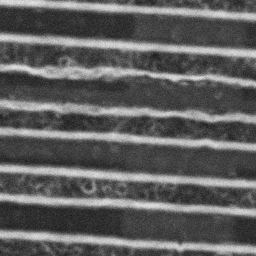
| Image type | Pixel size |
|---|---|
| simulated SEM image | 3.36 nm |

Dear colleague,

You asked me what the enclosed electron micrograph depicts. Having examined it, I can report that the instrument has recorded one or a few lines or trenches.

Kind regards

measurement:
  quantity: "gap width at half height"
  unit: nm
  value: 119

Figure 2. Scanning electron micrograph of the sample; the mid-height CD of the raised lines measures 98.5 nm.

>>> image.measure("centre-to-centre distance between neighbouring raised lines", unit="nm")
219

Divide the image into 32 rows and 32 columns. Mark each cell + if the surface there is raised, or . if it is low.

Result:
.....+++++++++++++++++++++++++++
.......................+++++++++
................................
................................
................................
+++++++++++++...................
+++++++++++++++++++++++++++++...
++++++++++++++++++++++++++++++++
+.++++++++++++++++++++++++++++++
....................++++++++++++
................................
................................
................................
++++++++++......................
+++++++++++++++++++++++++.......
++++++++++++++++++++++++++++++++
..++++++++++++++++++++++++++++++
..................++++++++++++++
................................
................................
................................
++++++++........................
++++++++++++++++++++++++........
++++++++++++++++++++++++++++++++
++++++++++++++++++++++++++++++++
................++++++++++++++++
.............................+++
................................
................................
++++............................
++++++++++++++++++..............
++++++++++++++++++++++++++++++++